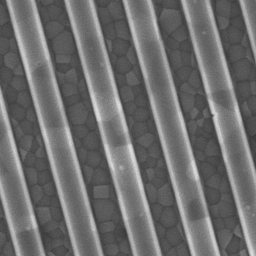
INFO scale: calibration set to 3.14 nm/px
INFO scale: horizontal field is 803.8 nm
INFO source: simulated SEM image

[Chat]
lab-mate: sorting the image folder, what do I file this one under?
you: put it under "parallel lines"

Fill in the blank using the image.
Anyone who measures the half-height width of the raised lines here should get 77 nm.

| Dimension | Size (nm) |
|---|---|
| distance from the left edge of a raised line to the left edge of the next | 177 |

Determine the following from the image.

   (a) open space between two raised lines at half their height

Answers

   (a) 31.1 px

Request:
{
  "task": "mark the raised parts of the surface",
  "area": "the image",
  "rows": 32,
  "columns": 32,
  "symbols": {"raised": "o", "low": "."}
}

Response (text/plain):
.ooo....oooo....ooo....ooo....oo
.oooo....ooo....ooo....ooo....oo
..ooo....ooo....ooo....oooo....o
..ooo....ooo....oooo....ooo....o
..ooo....oooo....ooo....ooo....o
..oooo....ooo....ooo....oooo....
...ooo....ooo....ooo.....ooo....
...ooo....ooo....oooo....ooo....
...ooo.....ooo....ooo....ooo....
....ooo....ooo....ooo....oooo...
....ooo....ooo....oooo....ooo...
....ooo....oooo....ooo....ooo...
....ooo.....ooo....ooo....ooo...
o....ooo....ooo....ooo....oooo..
o....ooo....ooo....oooo....ooo..
o....ooo....oooo....ooo....ooo..
o....oooo....ooo....ooo....ooo..
oo....ooo....ooo....ooo....oooo.
oo....ooo....ooo....oooo....ooo.
oo....ooo.....ooo....ooo....ooo.
oo....oooo....ooo....ooo....oooo
ooo....ooo....ooo....oooo....ooo
ooo....ooo....ooo.....ooo....ooo
ooo....ooo.....ooo....ooo....ooo
oooo....ooo....ooo....ooo....ooo
.ooo....ooo....ooo....oooo....oo
.ooo....ooo....oooo....ooo....oo
.ooo....oooo....ooo....ooo....oo
.oooo....ooo....ooo....ooo....oo
..ooo....ooo....ooo....oooo....o
..ooo....ooo....oooo....ooo....o
..ooo....oooo....ooo....ooo....o